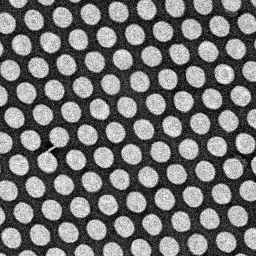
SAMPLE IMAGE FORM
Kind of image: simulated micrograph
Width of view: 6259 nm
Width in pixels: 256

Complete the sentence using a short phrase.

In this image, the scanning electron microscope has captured a regular array of raised bodies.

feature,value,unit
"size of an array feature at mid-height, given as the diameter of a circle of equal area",493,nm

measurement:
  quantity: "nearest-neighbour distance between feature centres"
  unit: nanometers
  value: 671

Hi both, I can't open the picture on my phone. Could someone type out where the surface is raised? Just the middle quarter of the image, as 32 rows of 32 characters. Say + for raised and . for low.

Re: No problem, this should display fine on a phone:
+++...++++...++++....+..........
+++....++................++....+
++...............+++....++++...+
....++....+++....++++...++++...+
..+++++..+++++...++++...++++...+
..+++++..+++++...++++....+++....
...++++...++++....+++...........
...++++....+................+++.
..............++.....++++...++++
.......+++....++++...++++...++++
++++...++++..+++++...++++...++++
++++...++++...++++...++++....++.
++++...++++...++++....++........
++++....+++..............+++....
.++...............+++....++++...
....++.....+++....++++...++++...
...+++++..+++++...++++...++++...
+...++++...++++...++++....+++...
+...++++...++++....+++..........
+...++++....++...............+++
...............+++....++++...+++
..+.....++++...++++...++++...+++
.++++...++++..+++++...+++++..+++
.++++...++++...++++...++++....++
.++++...++++...++++.............
.++++....+++...............++...
.............++....+++....++++..
.....+++....++++...++++...+++++.
+....++++...++++...+++++..+++++.
++...++++...++++...++++....+++..
+++..++++...++++....+++.........
++....+++...............++....++